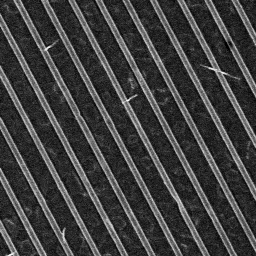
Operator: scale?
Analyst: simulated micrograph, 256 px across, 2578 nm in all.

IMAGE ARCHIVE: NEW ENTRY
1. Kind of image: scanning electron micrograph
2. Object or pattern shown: parallel lines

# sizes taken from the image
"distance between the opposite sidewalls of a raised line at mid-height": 52.4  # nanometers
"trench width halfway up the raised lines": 184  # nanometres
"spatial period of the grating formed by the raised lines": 242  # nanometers